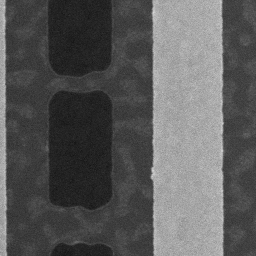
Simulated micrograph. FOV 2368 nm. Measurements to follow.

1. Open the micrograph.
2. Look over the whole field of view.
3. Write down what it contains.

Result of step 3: one or a few lines or trenches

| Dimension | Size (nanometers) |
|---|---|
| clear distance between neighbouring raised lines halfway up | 391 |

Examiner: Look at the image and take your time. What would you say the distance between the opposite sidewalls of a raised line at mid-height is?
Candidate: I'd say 68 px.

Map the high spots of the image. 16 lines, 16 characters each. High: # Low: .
...####...####..
...####...####..
...####...####..
...####...####..
...###....####..
..........####..
...####...####..
...####...####..
...####...####..
...####...####..
...####...####..
...####...####..
...####...####..
..........####..
..........####..
...####...####..